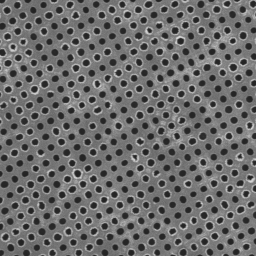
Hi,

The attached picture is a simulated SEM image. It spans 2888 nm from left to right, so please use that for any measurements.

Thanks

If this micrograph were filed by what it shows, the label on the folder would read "a regular array of holes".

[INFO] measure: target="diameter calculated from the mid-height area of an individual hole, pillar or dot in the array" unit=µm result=0.0764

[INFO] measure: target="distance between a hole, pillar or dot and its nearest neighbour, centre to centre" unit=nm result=129